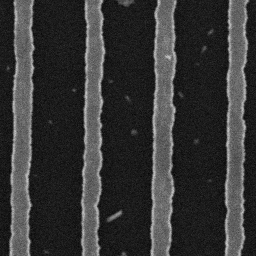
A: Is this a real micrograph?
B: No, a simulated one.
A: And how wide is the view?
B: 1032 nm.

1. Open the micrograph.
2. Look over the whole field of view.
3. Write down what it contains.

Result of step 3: lines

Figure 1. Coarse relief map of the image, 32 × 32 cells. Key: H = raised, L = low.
LLHHLLLLLLLHHLLLLLLLHHLLLLLLLHHL
LLHHLLLLLLLHHLLLLLLLHHLLLLLLLHHL
LLHHLLLLLLLHHLLLLLLLHHLLLLLLLHHL
LLHHLLLLLLLHHLLLLLLLHHLLLLLLLHHL
LLHHLLLLLLLHHLLLLLLHHHLLLLLLLHHL
LLHHLLLLLLLHHLLLLLLHHHLLLLLLLHHL
LLHHLLLLLLLHHLLLLLLHHHLLLLLLLHHL
LLHHLLLLLLLHHLLLLLLHHHLLLLLLLHHL
LLHHLLLLLLLHHLLLLLLHHHLLLLLLLHLL
LLHHLLLLLLLHHLLLLLLLHHLLLLLLHHHL
LLHHLLLLLLLHHLLLLLLLHHLLLLLLHHHL
LLHHLLLLLLLHHLLLLLLHHHLLLLLLHHHL
LLHHLLLLLLLHHLLLLLLHHHLLLLLLLHHL
LLHHLLLLLLLHHLLLLLLHHHLLLLLLLHLL
LLHHLLLLLLLHHLLLLLLHHHLLLLLLHHLL
LLHHLLLLLLLHHLLLLLLHHHLLLLLLHHHL
LLHHLLLLLLLHHLLLLLLHHLLLLLLLHHHL
LLHHLLLLLLLHHLLLLLLHHLLLLLLLHHLL
LLHHLLLLLLLHHLLLLLLHHHLLLLLLHHHL
LLHHLLLLLLLHHLLLLLLHHLLLLLLLHHHL
LLHHLLLLLLLHHLLLLLLHHLLLLLLLHHLL
LHHHLLLLLLHHLLLLLLLHHLLLLLLLHHLL
LHHLLLLLLLHHHLLLLLLHHHLLLLLLHHLL
LLHLLLLLLLHHHLLLLLLHHHLLLLLLHHLL
LHHHLLLLLLHHLLLLLLLHHLLLLLLLHHLL
LHHHLLLLLLHHLLLLLLLHHLLLLLLLHHLL
LLHHLLLLLLHHLLLLLLLHHLLLLLLLHHLL
LLHHLLLLLLHHLLLLLLLHHLLLLLLLHHLL
LHHHLLLLLLHHLLLLLLLHHLLLLLLLHHLL
LHHHLLLLLLHHLLLLLLLHHLLLLLLLHHHL
LHHHLLLLLLHHLLLLLLLHHLLLLLLLHHLL
LHHHLLLLLLHHLLLLLLLHHLLLLLLLHHLL